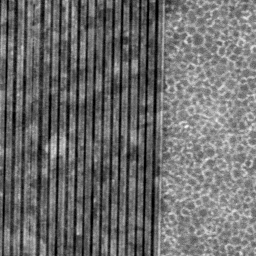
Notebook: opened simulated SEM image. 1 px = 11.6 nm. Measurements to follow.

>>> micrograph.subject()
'parallel lines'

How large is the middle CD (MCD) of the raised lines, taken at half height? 62.5 nanometers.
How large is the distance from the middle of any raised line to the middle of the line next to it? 102 nm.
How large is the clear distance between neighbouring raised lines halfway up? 42.2 nm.